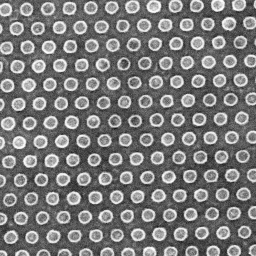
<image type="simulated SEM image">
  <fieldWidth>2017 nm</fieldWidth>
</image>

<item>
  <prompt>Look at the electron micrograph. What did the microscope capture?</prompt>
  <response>a regular array of raised bodies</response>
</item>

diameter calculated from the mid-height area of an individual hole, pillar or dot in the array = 95.3 nm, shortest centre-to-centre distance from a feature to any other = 166 nanometres